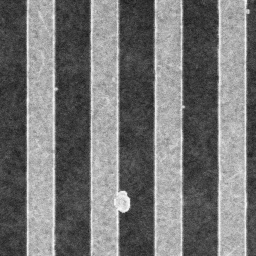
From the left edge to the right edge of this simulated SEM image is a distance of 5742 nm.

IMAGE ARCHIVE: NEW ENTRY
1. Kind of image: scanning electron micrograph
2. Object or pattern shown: wiring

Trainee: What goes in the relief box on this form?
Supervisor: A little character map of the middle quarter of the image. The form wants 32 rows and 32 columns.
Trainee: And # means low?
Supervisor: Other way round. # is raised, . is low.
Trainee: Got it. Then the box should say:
.......######..........######...
.......######..........######...
.......######..........######...
.......######..........######...
.......######..........######...
.......######..........######...
.......######..........######...
.......######..........######...
.......######..........######...
.......######..........######...
.......######..........######...
.......######..........######...
.......######..........######...
.......######..........######...
.......######..........######...
.......######..........######...
.......######..........######...
.......######..........######...
.......######..........######...
.......######..........######...
.......######..........######...
.......######..........######...
.......######..........######...
.......######..........######...
.......######..........######...
.......######..........######...
.......######..........######...
.......######..........######...
.......######..........######...
.......######..........######...
.......######..........######...
.......######..........######...